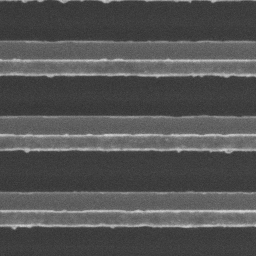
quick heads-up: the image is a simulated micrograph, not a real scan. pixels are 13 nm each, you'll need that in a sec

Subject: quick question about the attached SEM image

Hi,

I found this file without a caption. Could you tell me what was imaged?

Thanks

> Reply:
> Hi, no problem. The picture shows lines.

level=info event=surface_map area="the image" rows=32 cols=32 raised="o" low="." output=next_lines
................................
................................
................................
................................
................................
oooooooooooooooooooooooooooooooo
oooooooooooooooooooooooooooooooo
oooooooooooooooooooooooooooooooo
oooooooooooooooooooooooooooooooo
......o............o....o..oo.oo
................................
................................
................................
................................
................................
oooooooooooooooooooooooooooooooo
oooooooooooooooooooooooooooooooo
oooooooooooooooooooooooooooooooo
oooooooooooooooooooooooooooooooo
................................
................................
................................
................................
................................
oooooooooooooooooooooooooooooooo
oooooooooooooooooooooooooooooooo
oooooooooooooooooooooooooooooooo
oooooooooooooooooooooooooooooooo
................................
................................
................................
................................